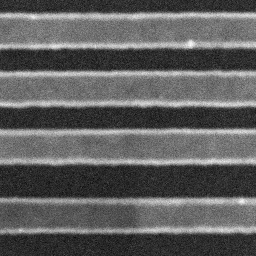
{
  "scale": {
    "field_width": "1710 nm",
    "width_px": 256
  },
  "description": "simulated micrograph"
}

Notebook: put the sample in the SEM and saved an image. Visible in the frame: lines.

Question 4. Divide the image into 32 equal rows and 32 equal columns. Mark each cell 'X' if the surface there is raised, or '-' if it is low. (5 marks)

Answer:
--------------------------------
--------------------------------
XXXXXXXXXXXXXXXXXXXXXXXXXXXXXXXX
XXXXXXXXXXXXXXXXXXXXXXXXXXXXXXXX
XXXXXXXXXXXXXXXXXXXXXXXXXXXXXXXX
XXXXXXXXXXXXXXXXXXXXXXXXXXXXXXXX
--------------------------------
--------------------------------
--------------------------------
XXXXXXXXXXXXXXXXXXXXXXXXXXXXXXXX
XXXXXXXXXXXXXXXXXXXXXXXXXXXXXXXX
XXXXXXXXXXXXXXXXXXXXXXXXXXXXXXXX
XXXXXXXXXXXXXXXXXXXXXXXXXXXXXXXX
--------------------------------
--------------------------------
--------------------------------
--------XXXXXXXXXXXXXXXXXXXXXXXX
XXXXXXXXXXXXXXXXXXXXXXXXXXXXXXXX
XXXXXXXXXXXXXXXXXXXXXXXXXXXXXXXX
XXXXXXXXXXXXXXXXXXXXXXXXXXXXXXXX
--------------------------------
--------------------------------
--------------------------------
--------------------------------
--------------------------------
XXXXXXXXXXXXXXXXXXXXXXXXXXXXXXXX
XXXXXXXXXXXXXXXXXXXXXXXXXXXXXXXX
XXXXXXXXXXXXXXXXXXXXXXXXXXXXXXXX
XXXXXXXXXXXXXXXXXXXXXXXXXXXXXXXX
--------------------------------
--------------------------------
--------------------------------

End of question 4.